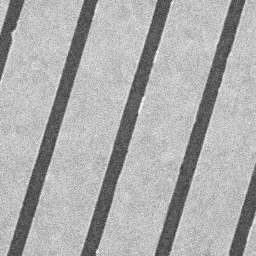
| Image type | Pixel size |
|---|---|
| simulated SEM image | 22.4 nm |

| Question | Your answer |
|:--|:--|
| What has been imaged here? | one or a few lines or trenches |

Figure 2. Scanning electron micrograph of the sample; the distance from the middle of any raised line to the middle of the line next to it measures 1580 nanometres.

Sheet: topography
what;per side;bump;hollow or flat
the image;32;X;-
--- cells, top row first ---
X--XXXXXXX--XXXXXXX--XXXXXXXX--X
X--XXXXXXX--XXXXXXX--XXXXXXX--XX
--XXXXXXXX--XXXXXXX--XXXXXXX--XX
--XXXXXXX--XXXXXXXX--XXXXXXX--XX
--XXXXXXX--XXXXXXX--XXXXXXX--XXX
--XXXXXXX--XXXXXXX--XXXXXXX--XXX
-XXXXXXX--XXXXXXXX--XXXXXXX--XXX
-XXXXXXX--XXXXXXX--XXXXXXXX--XXX
-XXXXXXX--XXXXXXX--XXXXXXX--XXXX
XXXXXXXX--XXXXXXX--XXXXXXX--XXXX
XXXXXXX--XXXXXXX--XXXXXXXX--XXXX
XXXXXXX--XXXXXXX--XXXXXXX--XXXXX
XXXXXXX--XXXXXXX--XXXXXXX--XXXXX
XXXXXX--XXXXXXX---XXXXXXX--XXXXX
XXXXXX--XXXXXXX--XXXXXXX---XXXXX
XXXXXX--XXXXXXX--XXXXXXX--XXXXXX
XXXXX---XXXXXXX--XXXXXXX--XXXXXX
XXXXX--XXXXXXX--XXXXXXXX--XXXXXX
XXXXX--XXXXXXX--XXXXXXX--XXXXXXX
XXXXX--XXXXXXX--XXXXXXX--XXXXXXX
XXXX--XXXXXXX---XXXXXXX--XXXXXXX
XXXX--XXXXXXX--XXXXXXX--XXXXXXX-
XXXX--XXXXXXX--XXXXXXX--XXXXXXX-
XXX--XXXXXXXX--XXXXXXX--XXXXXXX-
XXX--XXXXXXX--XXXXXXX---XXXXXXX-
XXX--XXXXXXX--XXXXXXX--XXXXXXX--
XX---XXXXXXX--XXXXXXX--XXXXXXX--
XX--XXXXXXX--XXXXXXXX--XXXXXXX--
XX--XXXXXXX--XXXXXXX--XXXXXXX--X
XX--XXXXXXX--XXXXXXX--XXXXXXX--X
X--XXXXXXX--XXXXXXXX--XXXXXXX--X
X--XXXXXXX--XXXXXXX--XXXXXXXX--X